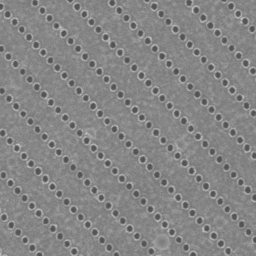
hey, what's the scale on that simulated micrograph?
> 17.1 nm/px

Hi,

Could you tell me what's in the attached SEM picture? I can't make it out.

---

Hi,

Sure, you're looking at a regular array of holes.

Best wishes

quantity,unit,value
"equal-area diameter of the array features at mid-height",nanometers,110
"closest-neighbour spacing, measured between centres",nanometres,176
